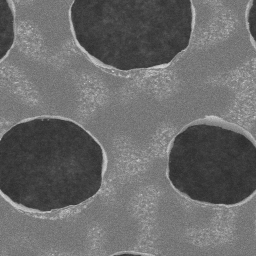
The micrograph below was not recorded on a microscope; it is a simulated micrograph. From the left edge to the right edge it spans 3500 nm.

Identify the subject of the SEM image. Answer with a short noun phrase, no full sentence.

holes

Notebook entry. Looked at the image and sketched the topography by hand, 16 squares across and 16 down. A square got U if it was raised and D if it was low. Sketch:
DUUUDDDDDDDDUUUU
DUUUUDDDDDDDUUUU
DUUUUDDDDDDDUUUU
UUUUUUDDDDDUUUUU
UUUUUUUUUUUUUUUU
UUUUUUUUUUUUUUUU
UUUUUUUUUUUUUUUU
UUDDUUUUUUUUUUUU
DDDDDDUUUUUDDDDD
DDDDDDUUUUUDDDDD
DDDDDDUUUUUDDDDD
DDDDDDUUUUUDDDDD
UDDDDUUUUUUUDDDU
UUUUUUUUUUUUUUUU
UUUUUUUUUUUUUUUU
UUUUUUUUUUUUUUUU